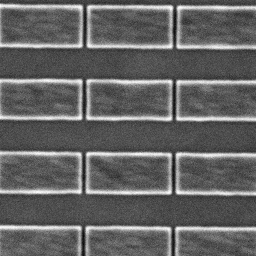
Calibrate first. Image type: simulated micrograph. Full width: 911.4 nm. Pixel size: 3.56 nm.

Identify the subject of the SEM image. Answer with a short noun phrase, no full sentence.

wiring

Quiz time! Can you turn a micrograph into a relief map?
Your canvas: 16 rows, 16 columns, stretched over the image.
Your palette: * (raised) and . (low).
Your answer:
*****.****..****
****************
****************
................
................
****************
****************
...........**.**
................
*...............
****************
****************
................
................
****************
****************